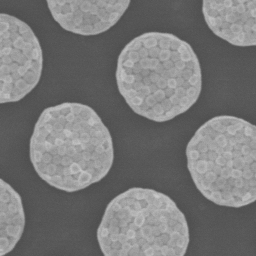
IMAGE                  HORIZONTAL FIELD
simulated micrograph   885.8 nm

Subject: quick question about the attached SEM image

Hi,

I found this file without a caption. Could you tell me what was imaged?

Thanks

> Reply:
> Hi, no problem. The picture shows raised bodies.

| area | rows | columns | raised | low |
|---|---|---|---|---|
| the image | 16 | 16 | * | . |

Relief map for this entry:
...*****.....***
**..***......***
**......***...**
***.....****....
***....*****....
**.....******...
....*...****....
..****.......**.
..*****.....****
..*****.....****
..*****.....****
...***......****
*......****..***
*.....*****.....
*.....******....
*.....******....